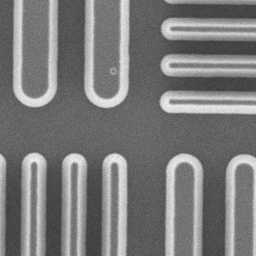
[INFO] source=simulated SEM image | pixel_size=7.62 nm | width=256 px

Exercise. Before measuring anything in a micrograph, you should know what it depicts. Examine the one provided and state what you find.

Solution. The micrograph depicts groups of lines, slits or small figures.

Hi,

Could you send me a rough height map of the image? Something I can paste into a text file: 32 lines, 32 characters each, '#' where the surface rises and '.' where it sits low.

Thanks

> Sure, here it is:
..#####....#####................
..#####....#####................
..#####....#####................
..#####....#####.....###########
..#####....#####........########
..#####....#####................
..#####....#####................
..#####....#####.....###########
..#####....#####.....###########
..#####....#####................
..#####....#####................
..####.....####.................
...###......###......###########
.....................###########
................................
................................
................................
................................
................................
................................
...##...##...##.......###....###
...##...##...##......####....###
...##...##...##......####....###
...##...##...##......####....###
...##...##...##......####....###
...##...##...##......####....###
...##...##...##......####....###
...##...##...##......####....###
...##...##...##......####....###
...##...##...##......####....###
...##...##...##......####....###
...##...##...##......####....###